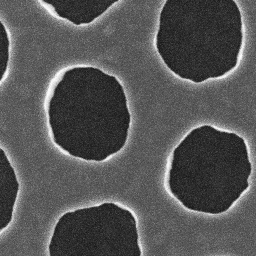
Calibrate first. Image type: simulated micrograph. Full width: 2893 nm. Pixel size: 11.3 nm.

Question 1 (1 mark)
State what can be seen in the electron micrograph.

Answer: holes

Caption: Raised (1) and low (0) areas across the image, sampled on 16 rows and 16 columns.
1110000111000001
1111111111000001
0111111111000001
0111111111000001
1111001111100011
1110000011111111
1110000011111111
1110000011111111
1110000011110001
1111000111100001
0111111111100000
0111111111000001
0111111111100001
0111000011111111
1110000001111111
1110000001111111